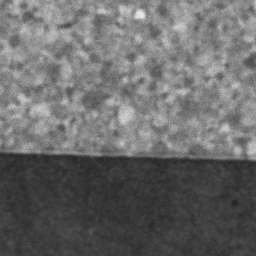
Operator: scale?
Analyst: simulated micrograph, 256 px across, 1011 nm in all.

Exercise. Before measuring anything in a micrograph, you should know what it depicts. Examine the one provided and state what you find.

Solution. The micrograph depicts one or a few lines or trenches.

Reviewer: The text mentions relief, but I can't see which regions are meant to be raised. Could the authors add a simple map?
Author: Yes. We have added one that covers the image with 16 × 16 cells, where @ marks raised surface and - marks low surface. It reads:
@@@@@@@@@@@@@@@@
@@@@@@@@@@@@@@@@
@@@@@@@@@@@@@@@@
@@@@@@@@@@@@@@@@
@@@@@@@@@@@@@@@@
@@@@@@@@@@@@@@@@
@@@@@@@@@@@@@@@@
@@@@@@@@@@@@@@@@
@@@@@@@@@@@@@@@@
---@@@@@@@@@@@@@
----------------
----------------
----------------
----------------
----------------
----------------